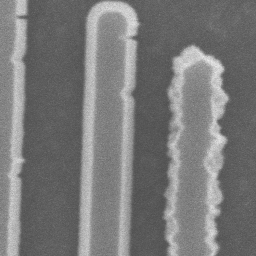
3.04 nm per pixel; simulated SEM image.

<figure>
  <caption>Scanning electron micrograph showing one or a few lines or trenches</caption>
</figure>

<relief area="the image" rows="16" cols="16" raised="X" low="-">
X-----XX--------
X-----XX--------
X-----XX--------
X-----XX----X---
X-----XX---XXX--
X----XXX---XXX--
X----XXX---XXX--
X----XXX---XXX--
X----XXX---XXX--
X----XXX---XXX--
X----XXX---XX---
X----XXX---XX---
X----XXX---XXX--
X----XXX--XXX---
X----XXX---XX---
X----XXX---XX---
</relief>